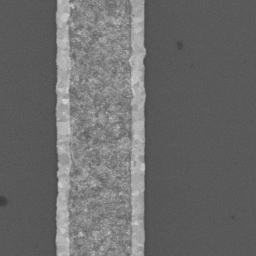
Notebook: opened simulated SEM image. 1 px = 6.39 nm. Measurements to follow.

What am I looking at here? one or a few lines or trenches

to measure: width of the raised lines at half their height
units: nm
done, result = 479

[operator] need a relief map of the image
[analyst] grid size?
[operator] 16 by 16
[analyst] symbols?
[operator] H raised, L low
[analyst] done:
LLLLHHHHHLLLLLLL
LLLLHHHHHLLLLLLL
LLLLHHHHHLLLLLLL
LLLLHHHHHLLLLLLL
LLLLHHHHHLLLLLLL
LLLLHHHHHLLLLLLL
LLLLHHHHHLLLLLLL
LLLLHHHHHLLLLLLL
LLLLHHHHHLLLLLLL
LLLLHHHHHLLLLLLL
LLLLHHHHHLLLLLLL
LLLLHHHHHLLLLLLL
LLLLHHHHHLLLLLLL
LLLLHHHHHLLLLLLL
LLLLHHHHHLLLLLLL
LLLLHHHHHLLLLLLL